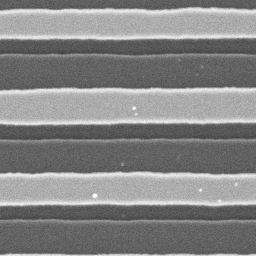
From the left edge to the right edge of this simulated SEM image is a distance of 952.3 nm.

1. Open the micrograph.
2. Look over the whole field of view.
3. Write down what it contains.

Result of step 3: lines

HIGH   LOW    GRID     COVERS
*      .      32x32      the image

................................
********************************
********************************
********************************
********************************
................................
................................
................................
................................
................................
................................
********************************
********************************
********************************
********************************
.****.***.......................
................................
................................
................................
................................
................................
................................
********************************
********************************
********************************
************.*******************
................................
................................
................................
................................
................................
................................